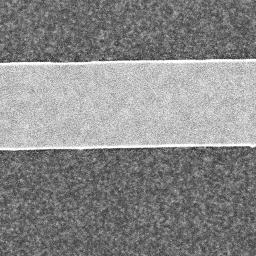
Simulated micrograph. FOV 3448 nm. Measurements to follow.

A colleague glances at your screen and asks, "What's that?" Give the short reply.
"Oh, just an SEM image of one or a few lines or trenches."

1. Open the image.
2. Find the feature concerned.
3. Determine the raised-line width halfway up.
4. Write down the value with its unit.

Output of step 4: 1.15 microns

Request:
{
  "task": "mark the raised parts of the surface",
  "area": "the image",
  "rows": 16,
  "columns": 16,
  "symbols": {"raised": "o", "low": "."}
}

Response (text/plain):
................
................
................
................
oooooooooooooooo
oooooooooooooooo
oooooooooooooooo
oooooooooooooooo
oooooooooooooooo
................
................
................
................
................
................
................